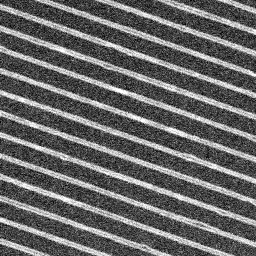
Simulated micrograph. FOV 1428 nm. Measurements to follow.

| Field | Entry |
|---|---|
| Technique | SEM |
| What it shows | parallel lines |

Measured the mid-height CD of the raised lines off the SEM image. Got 21.8 nm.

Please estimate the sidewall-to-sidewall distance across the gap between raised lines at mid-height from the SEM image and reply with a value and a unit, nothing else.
89 nm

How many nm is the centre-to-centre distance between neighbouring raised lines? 112